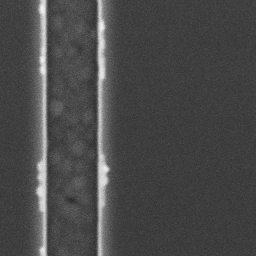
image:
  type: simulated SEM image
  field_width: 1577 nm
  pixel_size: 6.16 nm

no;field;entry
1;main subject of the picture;one or a few lines or trenches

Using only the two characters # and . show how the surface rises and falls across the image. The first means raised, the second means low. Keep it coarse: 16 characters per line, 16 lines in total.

###...##########
###...##########
###...##########
###...##########
###...##########
###...##########
###...##########
###...##########
###...##########
###...##########
###...##########
###...##########
###...##########
###...##########
###...##########
###...##########